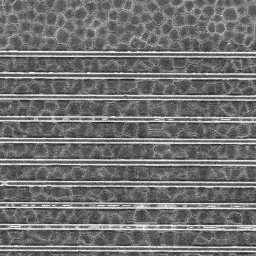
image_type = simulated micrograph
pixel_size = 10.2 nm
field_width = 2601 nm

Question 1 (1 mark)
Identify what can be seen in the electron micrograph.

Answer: parallel lines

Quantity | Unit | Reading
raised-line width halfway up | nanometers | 47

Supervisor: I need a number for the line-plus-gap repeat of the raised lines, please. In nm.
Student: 220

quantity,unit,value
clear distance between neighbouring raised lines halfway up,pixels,16.7